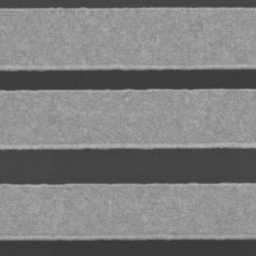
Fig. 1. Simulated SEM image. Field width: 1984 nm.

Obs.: lines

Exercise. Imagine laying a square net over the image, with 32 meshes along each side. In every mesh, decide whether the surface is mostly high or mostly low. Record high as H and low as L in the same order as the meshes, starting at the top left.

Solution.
LLLLLLLLLLLLLLLLLLLLLLLLLLLLLLLL
HHHHHHHHHHHHHHHHHHHHHHHHHHHHHHHH
HHHHHHHHHHHHHHHHHHHHHHHHHHHHHHHH
HHHHHHHHHHHHHHHHHHHHHHHHHHHHHHHH
HHHHHHHHHHHHHHHHHHHHHHHHHHHHHHHH
HHHHHHHHHHHHHHHHHHHHHHHHHHHHHHHH
HHHHHHHHHHHHHHHHHHHHHHHHHHHHHHHH
HHHHHHHHHHHHHHHHHHHHHHHHHHHHHHHH
HHHHHHHHHHHHHHHHHHHHHHHHHHHHHHHH
LLLLLLLLLLLLLLLLLLLLLLLLLLLLLLLL
LLLLLLLLLLLLLLLLLLLLLLLLLLLLLLLL
HHHHHHHHHHHHHHHHHHHHHHHHHHHHHHHH
HHHHHHHHHHHHHHHHHHHHHHHHHHHHHHHH
HHHHHHHHHHHHHHHHHHHHHHHHHHHHHHHH
HHHHHHHHHHHHHHHHHHHHHHHHHHHHHHHH
HHHHHHHHHHHHHHHHHHHHHHHHHHHHHHHH
HHHHHHHHHHHHHHHHHHHHHHHHHHHHHHHH
HHHHHHHHHHHHHHHHHHHHHHHHHHHHHHHH
HHHHHLLLLLLLLLLLLLLLLLLLLLLLLLLL
LLLLLLLLLLLLLLLLLLLLLLLLLLLLLLLL
LLLLLLLLLLLLLLLLLLLLLLLLLLLLLLLL
LLLLLLLLLLLLLLLLLLLLLLLLLLLLLLLL
LLLLLLLLLLLLLLLLLLLLLLLLLLLLLLLL
HHHHHHHHHHHHHHHHHHHHHHHHHHHHHHHH
HHHHHHHHHHHHHHHHHHHHHHHHHHHHHHHH
HHHHHHHHHHHHHHHHHHHHHHHHHHHHHHHH
HHHHHHHHHHHHHHHHHHHHHHHHHHHHHHHH
HHHHHHHHHHHHHHHHHHHHHHHHHHHHHHHH
HHHHHHHHHHHHHHHHHHHHHHHHHHHHHHHH
HHHHHHHHHHHHHHHHHHHHHHHHHHHHHHHH
LLLLLLLLLLLLLLLLLLLLLLLLLLLLLLLL
LLLLLLLLLLLLLLLLLLLLLLLLLLLLLLLL